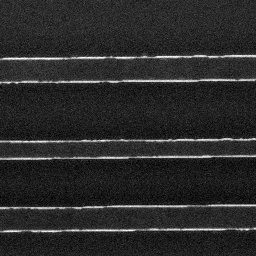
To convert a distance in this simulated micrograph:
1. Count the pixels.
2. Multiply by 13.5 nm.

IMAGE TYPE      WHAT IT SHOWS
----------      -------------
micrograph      lines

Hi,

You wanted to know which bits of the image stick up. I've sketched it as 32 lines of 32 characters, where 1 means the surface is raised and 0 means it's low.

00000000000000000000000000000000
00000000000000000000000000000000
00000000000000000000000000000000
00000000000000000000000000000000
00000000000000000000000000000000
00000000000000000000000000000000
00000000000000000000000000000000
11111111111111111111111111111111
11111111111111111111111111111111
11111111111111111111111111111111
00000000000000000000000000000000
00000000000000000000000000000000
00000000000000000000000000000000
00000000000000000000000000000000
00000000000000000000000000000000
00000000000000000000000000000000
00000000000000000000000000000000
00000000000000010000011111111111
11111111111111111111111111111111
11111111111111111111111111111111
00000000000000000000000000000000
00000000000000000000000000000000
00000000000000000000000000000000
00000000000000000000000000000000
00000000000000000000000000000000
00000000000000000000000000000000
11111111111111111111111111111111
11111111111111111111111111111111
11111111111111111111111111111111
00000000000000000000000000000000
00000000000000000000000000000000
00000000000000000000000000000000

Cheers